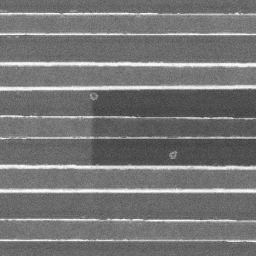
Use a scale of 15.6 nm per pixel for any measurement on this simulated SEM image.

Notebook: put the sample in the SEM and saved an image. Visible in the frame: lines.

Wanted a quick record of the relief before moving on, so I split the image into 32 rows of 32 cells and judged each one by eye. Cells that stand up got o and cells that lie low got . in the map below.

................................
................................
oooooooooooooooooooooooooooooooo
oooooooooooooooooooooooooooooooo
................................
................................
................................
................................
oooooooooooooooooooooooooooooooo
oooooooooooooooooooooooooooooooo
oooooooooooooooooooooooooooooooo
................................
................................
................................
................................
oooooooooooooooooooooooooooooooo
oooooooooooooooooooooooooooooooo
................................
................................
................................
................................
oooooooooooooooooooooooooooooooo
oooooooooooooooooooooooooooooooo
oooooooooooooooooooooooooooooooo
................................
................................
................................
oooooooooooo..oo.o..............
oooooooooooooooooooooooooooooooo
oooooooooooooooooooooooooooooooo
................................
................................